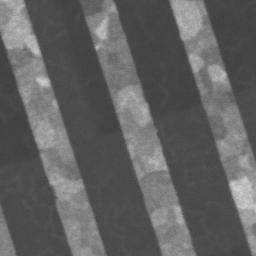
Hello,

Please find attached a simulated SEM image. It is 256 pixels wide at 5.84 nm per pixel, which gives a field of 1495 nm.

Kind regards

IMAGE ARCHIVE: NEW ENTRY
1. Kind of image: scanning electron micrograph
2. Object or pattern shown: one or a few lines or trenches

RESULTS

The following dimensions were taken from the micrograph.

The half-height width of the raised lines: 31.2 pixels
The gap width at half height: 315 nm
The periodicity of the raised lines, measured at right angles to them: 0.489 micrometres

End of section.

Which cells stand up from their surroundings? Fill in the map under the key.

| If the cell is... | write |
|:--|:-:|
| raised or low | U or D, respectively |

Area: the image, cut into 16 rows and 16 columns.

UUDDDUUDDDDUUDDD
UUDDDUUUDDDUUDDD
UUDDDDUUDDDUUDDD
DUUDDDUUDDDDUUDD
DUUDDDUUDDDDUUDD
DUUDDDDUUDDDUUDD
DUUUDDDUUDDDDUUD
DDUUDDDUUDDDDUUD
DDUUDDDDUUDDDUUD
DDUUUDDDUUDDDDUU
DDDUUDDDUUDDDDUU
DDDUUDDDDUUDDDUU
DDDUUDDDDUUDDDDU
DDDDUUDDDUUDDDDU
DDDDUUDDDDUUDDDU
UDDDUUDDDDUUDDDD